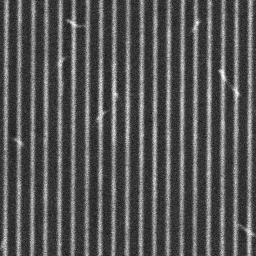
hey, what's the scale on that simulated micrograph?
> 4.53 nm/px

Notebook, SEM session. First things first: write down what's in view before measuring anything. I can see parallel lines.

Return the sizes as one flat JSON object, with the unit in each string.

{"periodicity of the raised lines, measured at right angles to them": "61.4 nm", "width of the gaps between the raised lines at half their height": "44.2 nm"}